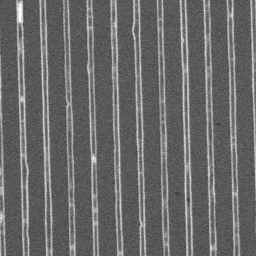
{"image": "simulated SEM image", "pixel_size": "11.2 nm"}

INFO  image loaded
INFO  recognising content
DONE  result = parallel lines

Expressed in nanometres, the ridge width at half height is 58.9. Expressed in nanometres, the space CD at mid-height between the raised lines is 202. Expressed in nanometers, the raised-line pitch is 263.